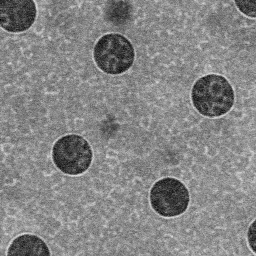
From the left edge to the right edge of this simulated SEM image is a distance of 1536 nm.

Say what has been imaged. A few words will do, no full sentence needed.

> holes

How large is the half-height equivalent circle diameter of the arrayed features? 251 nanometres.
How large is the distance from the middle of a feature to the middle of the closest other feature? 640 nanometers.